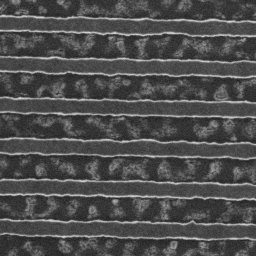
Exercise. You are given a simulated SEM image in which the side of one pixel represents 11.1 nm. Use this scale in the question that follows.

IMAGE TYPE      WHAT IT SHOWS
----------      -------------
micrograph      parallel lines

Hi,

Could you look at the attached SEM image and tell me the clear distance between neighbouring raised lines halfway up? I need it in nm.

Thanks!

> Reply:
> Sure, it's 280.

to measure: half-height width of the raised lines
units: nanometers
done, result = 171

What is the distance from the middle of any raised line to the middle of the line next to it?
452 nanometres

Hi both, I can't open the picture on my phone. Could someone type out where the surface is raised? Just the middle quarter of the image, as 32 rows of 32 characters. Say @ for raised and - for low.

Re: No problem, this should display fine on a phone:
@@@@@@@@@@@@@@@@@@@@@@@@@@@@@@@@
@@@@@@@@@@@@@@@@@@@@@@@@@@@@@@@@
---@@@@---@@@-@@@@@@@@@@@@@@@@@@
--------------------------------
--------------------------------
--------------------------------
--------------------------------
--------------------------------
--------------------------------
@@@@@@@@@@@@@@@@@@@@@@@@@@@@@@@@
@@@@@@@@@@@@@@@@@@@@@@@@@@@@@@@@
@@@@@@@@@@@@@@@@@@@@@@@@@@@@@@@@
@@---@@@@@@@@@@@@@@@@@@@@@@@@@@@
--------------------------------
--------------------------------
--------------------------------
--------------------------------
--------------------------------
--------------------------------
@@@@@@@@@@@@@@@@@@@@@@@@----@@@-
@@@@@@@@@@@@@@@@@@@@@@@@@@@@@@@@
@@@@@@@@@@@@@@@@@@@@@@@@@@@@@@@@
@@-@@@@@@@@@@@@@@@@@@@@@@@@@@@@@
--------------------------------
--------------------------------
--------------------------------
--------------------------------
--------------------------------
--------------------------------
@@@@@@@@@@@@@@@@@@@@@@@---@-----
@@@@@@@@@@@@@@@@@@@@@@@@@@@@@@@@
@@@@@@@@@@@@@@@@@@@@@@@@@@@@@@@@